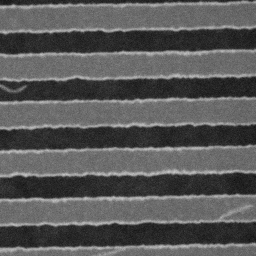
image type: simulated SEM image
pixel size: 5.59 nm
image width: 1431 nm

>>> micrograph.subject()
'lines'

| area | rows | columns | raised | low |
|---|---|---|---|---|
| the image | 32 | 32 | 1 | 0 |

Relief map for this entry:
00000000000000000000111111111111
11111111111111111111111111111111
11111111111111111111111111111111
11111111111111111111111111110111
00000000000000000000000000000000
00000000000000000000000000000000
00000000000000000000111001111111
11111111111111111111111111111111
11111111111111111111111111111111
11111111111111111111111111111110
00000000000000000000000000000000
00000000000000000000000000000000
00000000000000000111111111111111
11111111111111111111111111111111
11111111111111111111111111111111
11111111111111111111111111111111
00000000000000000000000000000000
00000000000000000000000000000000
00000000000000000000111111111111
11111111111111111111111111111111
11111111111111111111111111111111
11111111111111111111111111111011
00000000000000000000000000000000
00000000000000000000000000000000
00000000000000000000000111111111
11111111111111111111111111111111
11111111111111111111111111111111
11111111111111111111111111111111
00000000000000000000000000000000
00000000000000000000000000000000
00000000000000000000000000000101
11111111111111111111111111111111